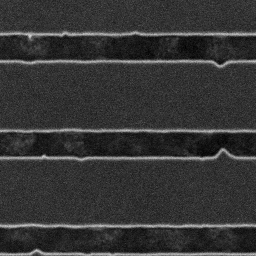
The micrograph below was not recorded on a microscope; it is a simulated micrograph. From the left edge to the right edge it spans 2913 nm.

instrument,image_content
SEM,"one or a few lines or trenches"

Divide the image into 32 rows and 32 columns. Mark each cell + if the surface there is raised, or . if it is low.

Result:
++++++++++++++++++++++++++++++++
++++++++++++++++++++++++++++++++
++++++++++++++++++++++++++++++++
++++++++++++++++++++++++++++++++
................................
................................
................................
................................
++++++++++++++++++++++++++++++++
++++++++++++++++++++++++++++++++
++++++++++++++++++++++++++++++++
++++++++++++++++++++++++++++++++
++++++++++++++++++++++++++++++++
++++++++++++++++++++++++++++++++
++++++++++++++++++++++++++++++++
++++++++++++++++++++++++++++++++
................................
................................
................................
...........................++...
++++++++++++++++++++++++++++++++
++++++++++++++++++++++++++++++++
++++++++++++++++++++++++++++++++
++++++++++++++++++++++++++++++++
++++++++++++++++++++++++++++++++
++++++++++++++++++++++++++++++++
++++++++++++++++++++++++++++++++
++++++++++++++++++++++++++++++++
................................
................................
................................
....+...........................